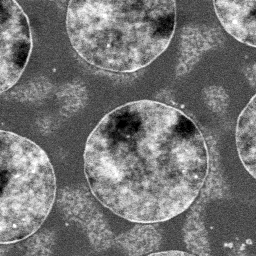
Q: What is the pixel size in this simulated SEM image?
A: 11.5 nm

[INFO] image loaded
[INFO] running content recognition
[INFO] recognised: holes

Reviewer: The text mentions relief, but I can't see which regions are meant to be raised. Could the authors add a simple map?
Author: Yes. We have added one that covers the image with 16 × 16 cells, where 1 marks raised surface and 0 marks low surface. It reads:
0111000000011000
0011000000011100
0011000000011110
0011100000111111
0111111111111111
1111111111111111
1111111100111111
1111110000001110
0111110000000110
0001100000000110
0001100000000110
0001110000000111
0001110000001111
0001111100011111
0011111111111111
1111111111111111